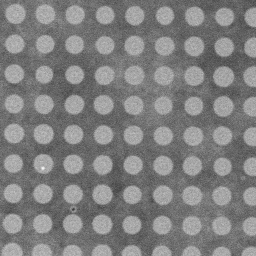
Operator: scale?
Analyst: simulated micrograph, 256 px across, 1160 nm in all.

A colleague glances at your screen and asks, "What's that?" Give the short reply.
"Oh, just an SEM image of an array of small figures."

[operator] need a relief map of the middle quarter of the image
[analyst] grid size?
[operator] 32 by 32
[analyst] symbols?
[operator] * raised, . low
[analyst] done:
................................
.***....****....****...****....*
*****...****...*****...****...**
.****...****...*****...****...**
.***....****....***....****....*
................................
................................
................................
.***....****....***.....**.....*
*****...****...*****...****...**
*****...****...*****...****...**
.***....****...****....****...**
.........**......*.............*
................................
................................
.**......**.....................
****....****...****....****...**
*****...****...*****...****...**
*****...****...*****...****...**
.***....***.....***....****...**
................................
................................
................................
****....***.....***....***.....*
*****...****...****...*****...**
*****..*****...*****..*****...**
****....****...****....****...**
.................*......**.....*
................................
................................
.**.....***.....................
****...*****...****....****...**